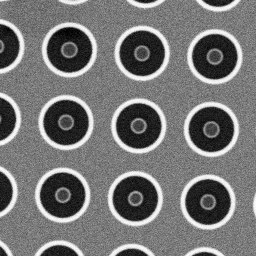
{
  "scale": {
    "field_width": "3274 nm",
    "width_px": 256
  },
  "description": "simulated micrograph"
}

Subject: an array of small figures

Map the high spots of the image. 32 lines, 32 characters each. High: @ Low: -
@@@@@@@@@@@@@@@@@--@@@@@@----@@@
@@@@@@@@@@@@@@@@@@@@@@@@@@@@@@@@
@@@@@@@@@@@@@@@@@@@@@@@@@@@@@@@@
--@@@@@---@@@@@@@@@@@@@@@@@@@@@@
--@@@@-----@@@@@----@@@@@---@@@@
---@@@--@---@@@------@@@-----@@@
---@@@--@@--@@@--@@--@@@--@@--@@
--@@@@-----@@@@------@@@--@@--@@
-@@@@@@----@@@@-----@@@@------@@
@@@@@@@@@@@@@@@@@--@@@@@@----@@@
@@@@@@@@@@@@@@@@@@@@@@@@@@@@@@@@
@@@@@@@@@@@@@@@@@@@@@@@@@@@@@@@@
-@@@@@@--@@@@@@@@@@@@@@@@@@@@@@@
--@@@@-----@@@@----@@@@@@---@@@@
--@@@---@--@@@@-----@@@@-----@@@
--@@@--@@--@@@--@@--@@@---@--@@@
--@@@------@@@---@--@@@---@--@@@
-@@@@@----@@@@@-----@@@@-----@@@
@@@@@@@@@@@@@@@@---@@@@@----@@@@
@@@@@@@@@@@@@@@@@@@@@@@@@@@@@@@@
@@@@@@@@@@@@@@@@@@@@@@@@@@@@@@@@
-@@@@@@--@@@@@@@@@@@@@@@@@@@@@@@
-@@@@-----@@@@@----@@@@@@--@@@@@
--@@@------@@@------@@@------@@@
--@@@--@@--@@@--@@--@@@------@@@
-@@@@------@@@--@---@@@--@@--@@@
@@@@@@----@@@@------@@@------@@@
@@@@@@@@@@@@@@@---@@@@@@----@@@@
@@@@@@@@@@@@@@@@@@@@@@@@@@@@@@@@
@@@@@@@@@@@@@@@@@@@@@@@@@@@@@@@@
@@@@@@@-@@@@@@@@@@@@@@@@@@@@@@@@
-@@@@-----@@@@@---@@@@@@---@@@@@